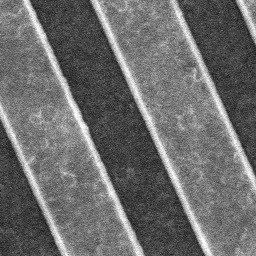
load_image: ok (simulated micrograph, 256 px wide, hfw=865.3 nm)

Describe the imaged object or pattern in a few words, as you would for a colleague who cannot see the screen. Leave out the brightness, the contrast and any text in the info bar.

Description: one or a few lines or trenches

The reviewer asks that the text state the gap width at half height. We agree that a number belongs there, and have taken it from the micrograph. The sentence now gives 203 nm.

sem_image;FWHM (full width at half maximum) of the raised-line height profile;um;0.249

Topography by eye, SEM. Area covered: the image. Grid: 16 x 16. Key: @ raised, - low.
@@----@@@@@----@
@@----@@@@@@----
@@@----@@@@@----
@@@----@@@@@----
@@@@----@@@@@---
@@@@----@@@@@---
@@@@@----@@@@@--
@@@@@----@@@@@--
-@@@@@----@@@@@-
-@@@@@----@@@@@-
--@@@@-----@@@@@
--@@@@@----@@@@@
--@@@@@----@@@@@
---@@@@@----@@@@
---@@@@@----@@@@
----@@@@@----@@@